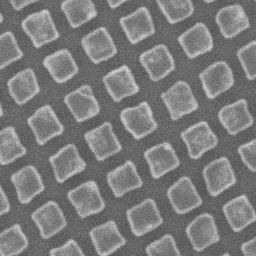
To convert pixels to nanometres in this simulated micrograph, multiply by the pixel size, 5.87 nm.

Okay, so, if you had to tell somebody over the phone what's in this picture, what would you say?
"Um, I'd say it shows a regular array of raised bodies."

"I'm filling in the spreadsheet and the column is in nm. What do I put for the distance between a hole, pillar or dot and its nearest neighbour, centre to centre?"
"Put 248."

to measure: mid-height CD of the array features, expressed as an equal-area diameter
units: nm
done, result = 187